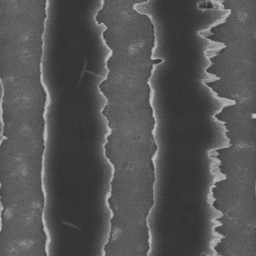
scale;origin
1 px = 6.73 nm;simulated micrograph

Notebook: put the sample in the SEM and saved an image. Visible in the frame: one or a few lines or trenches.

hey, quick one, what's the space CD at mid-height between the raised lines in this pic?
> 296 nanometres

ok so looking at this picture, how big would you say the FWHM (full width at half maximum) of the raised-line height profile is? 0.426 microns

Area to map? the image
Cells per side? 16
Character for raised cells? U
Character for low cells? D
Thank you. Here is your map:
DDDUUUDDDUUUUUDD
DDDUUUDDDDUUUUDD
DDDUUUUDDDUUUDDD
DDDUUUUDDDUUUDDD
DDDUUUUDDDUUUDDD
DDDUUUDDDUUUUDDD
DDDUUUUDDUUUUUDD
DDDUUUUDDDUUUUDD
DDDUUUUDDDUUUUDD
DDDUUUUDDDUUUUDD
DDDUUUUDDDUUUUDD
DDDUUUUDDDUUUUDD
DDDUUUUDDDUUUDDD
DDDUUUUDDUUUUUDD
DDDUUUUDDUUUUUDD
DDDUUUUDDUUUUUDD